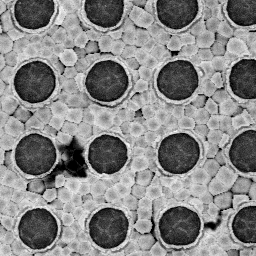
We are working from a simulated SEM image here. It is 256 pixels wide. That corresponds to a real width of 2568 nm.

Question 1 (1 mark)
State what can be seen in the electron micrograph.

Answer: a regular array of holes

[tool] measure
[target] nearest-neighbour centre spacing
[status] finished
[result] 711 nanometres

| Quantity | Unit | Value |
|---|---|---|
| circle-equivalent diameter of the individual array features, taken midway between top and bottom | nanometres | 420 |